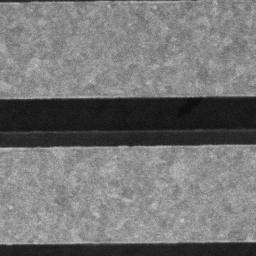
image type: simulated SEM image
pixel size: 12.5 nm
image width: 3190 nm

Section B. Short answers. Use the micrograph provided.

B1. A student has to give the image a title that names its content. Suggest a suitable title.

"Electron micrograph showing lines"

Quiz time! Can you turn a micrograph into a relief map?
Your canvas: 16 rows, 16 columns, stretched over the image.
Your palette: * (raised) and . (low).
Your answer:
****************
****************
****************
****************
****************
****************
................
................
................
****************
****************
****************
****************
****************
****************
................